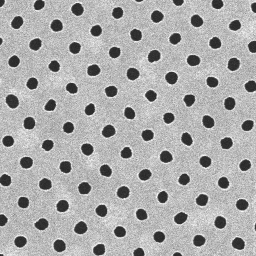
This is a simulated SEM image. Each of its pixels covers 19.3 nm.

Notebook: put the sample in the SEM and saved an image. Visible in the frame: a regular array of holes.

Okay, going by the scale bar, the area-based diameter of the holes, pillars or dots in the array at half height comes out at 232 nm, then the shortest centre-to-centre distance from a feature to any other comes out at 530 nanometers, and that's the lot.